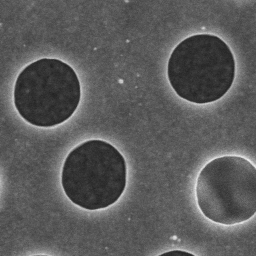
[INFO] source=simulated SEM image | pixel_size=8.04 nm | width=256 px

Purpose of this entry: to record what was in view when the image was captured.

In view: holes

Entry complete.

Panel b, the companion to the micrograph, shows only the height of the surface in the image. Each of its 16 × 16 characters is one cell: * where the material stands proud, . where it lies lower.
****************
****************
************..**
***********....*
*....******....*
*....******...**
*....***********
**..************
****************
****...*********
****....********
****....********
****...*********
****************
****************
****************